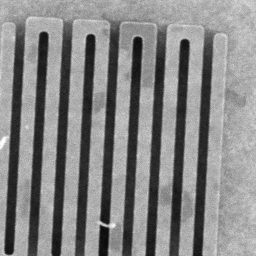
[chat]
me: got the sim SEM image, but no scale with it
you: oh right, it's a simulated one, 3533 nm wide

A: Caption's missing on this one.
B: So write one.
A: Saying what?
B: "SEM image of groups of lines, slits or small figures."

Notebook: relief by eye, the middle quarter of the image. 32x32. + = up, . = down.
..+++...+++...+++...+++..++++..+
..+++...+++...+++...++...++++..+
..+++...+++..++++..+++...+++...+
..+++...+++..++++..+++...+++...+
..+++...+++..++++..+++...+++...+
..+++...+++..++++..+++...+++...+
.++++...++...+++...+++...+++...+
.++++..+++...+++...+++...+++...+
.++++..+++...+++...+++...+++...+
.++++..+++...+++...+++...+++...+
.+++...+++...+++...+++...+++...+
.+++...+++...+++...+++...+++...+
.+++...+++...+++...+++...+++...+
.+++...+++...+++...+++...+++...+
.+++...+++...+++...+++...+++...+
.+++...+++...+++...+++...+++...+
.+++...+++...+++...+++..++++...+
.+++...+++...+++...+++..++++..++
.+++...+++...+++...+++..++++..++
.+++...+++...+++...+++..++++..++
.+++...+++...+++...+++..++++..++
.+++...+++..++++..++++..+++...++
.+++...+++..++++..++++..+++...++
.+++...+++..++++..++++..+++...++
.+++...+++..++++..++++..+++...++
++++..+++...+++...+++...+++...++
++++..+++...+++...+++...+++...++
++++..+++...+++...+++...+++...++
++++..+++...+++...+++...+++...++
+++...+++...+++...+++...+++...++
+++...+++...+++...+++...+++...++
+++...+++...+++...+++...+++...++